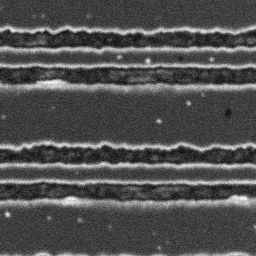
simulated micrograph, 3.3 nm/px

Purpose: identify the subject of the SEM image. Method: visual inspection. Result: lines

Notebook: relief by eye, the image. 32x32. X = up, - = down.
XXXXXXXXXXXXXXXXXXXXXXXXXXXXXXXX
XXXXXXXXXXXXXXXXXXXXXXXXXXXXXXXX
XXXXXXXXXXXXXXXXXXXXXXXXXXXXXXXX
XXXXXXXXXXXXXXXXXXXXXXXXXXXXXXXX
--------------------------------
--------------------------------
XXXXXXXXXXXXXXXXXXXXXXXXXXXXXXXX
XXXXXXXXXXXXXXXXXXXXXXXXXXXXXXXX
-----------------------------X--
--------------------------------
-----XXX------------------------
XXXXXXXXXXXXXXXXXXXXXXXXXXXXXXXX
XXXXXXXXXXXXXXXXXXXXXXXXXXXXXXXX
XXXXXXXXXXXXXXXXXXXXXXXXXXXXXXXX
XXXXXXXXXXXXXXXXXXXXXXXXXXXXXXXX
XXXXXXXXXXXXXXXXXXXXXXXXXXXXXXXX
XXXXXXXXXXXXXXXXXXXXXXXXXXXXXXXX
XXXXXXXXXXXXXXXXXXXXXXXXXXXXXXXX
XXX-----------XXXXXXXX--XXXXXX--
--------------------------------
-------X-----X------------------
XXXXXXXXXXXXXXXXXXXXXXXXXXXXXXXX
XXXXXXXXXXXXXXXXXXXXXXXXXXXXXXXX
--------------------------------
--------------------------------
XXXXXXXXXXXXXXXXXXXXXXXXXXXXXXXX
XXXXXXXXXXXXXXXXXXXXXXXXXXXXXXXX
XXXXXXXXXXXXXXXXXXXXXXXXXXXXXXXX
XXXXXXXXXXXXXXXXXXXXXXXXXXXXXXXX
XXXXXXXXXXXXXXXXXXXXXXXXXXXXXXXX
XXXXXXXXXXXXXXXXXXXXXXXXXXXXXXXX
XXXXXXXXXXXXXXXXXXXXXXXXXXXXXXXX